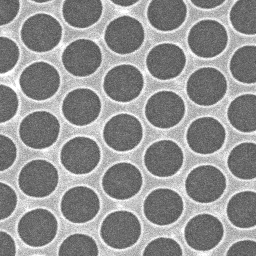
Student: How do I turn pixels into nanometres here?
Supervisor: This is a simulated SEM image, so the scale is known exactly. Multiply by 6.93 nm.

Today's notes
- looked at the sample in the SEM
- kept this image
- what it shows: a regular array of holes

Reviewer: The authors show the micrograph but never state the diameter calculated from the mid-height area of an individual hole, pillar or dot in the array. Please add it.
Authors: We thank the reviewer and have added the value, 275 nanometres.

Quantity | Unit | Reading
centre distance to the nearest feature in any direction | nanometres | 332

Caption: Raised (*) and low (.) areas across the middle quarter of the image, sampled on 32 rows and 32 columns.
.........****.....***.........**
........***........**.........**
**.....****.........**.......***
**********..........***.....***.
**********..........***********.
**********..........**********..
**.....***..........***********.
*.......**.........***......***.
.........***......***........**.
.........*****..*****.........**
.........***********..........**
.........***********..........**
.........****...****..........**
........****......**..........**
*......****........**........***
****.*****..........**......***.
**********..........***********.
**********..........***********.
**.....***..........***********.
*.......**.........****.....***.
.........**.......***........**.
.........***.....***..........**
.........***********..........**
.........***********..........**
.........*****..****..........**
........****......**..........**
*......****........**........***
**...*****.........***......***.
*********...........***********.
*********...........**********..
***..*****..........**********..
*......***.........***.....***..